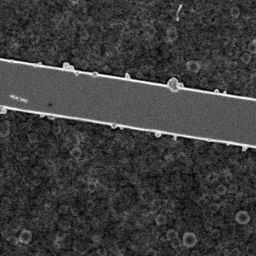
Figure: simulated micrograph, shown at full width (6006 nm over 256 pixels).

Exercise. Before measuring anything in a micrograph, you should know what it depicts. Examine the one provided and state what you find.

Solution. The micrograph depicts one or a few lines or trenches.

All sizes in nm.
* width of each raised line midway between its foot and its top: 1090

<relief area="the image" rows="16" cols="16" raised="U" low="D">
DDDDDDDDDDDDDDDD
DDDDDDDDDDDDDDDD
DDDDDDDDDDDDDDDD
DDDDDDDDDDDDDDDD
UUUUUDDDDDDDDDDD
UUUUUUUUUUUUDDDD
UUUUUUUUUUUUUUUU
DDDDDUUUUUUUUUUU
DDDDDDDDDDDDUUUU
DDDDDDDDDDDDDDDD
DDDDDDDDDDDDDDDD
DDDDDDDDDDDDDDDD
DDDDDDDDDDDDDDDD
DDDDDDDDDDDDDDDD
DDDDDDDDDDDDDDDD
DDDDDDDDDDDDDDDD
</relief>